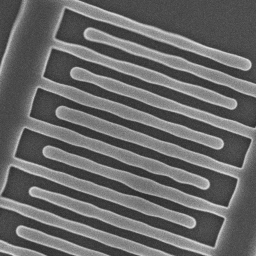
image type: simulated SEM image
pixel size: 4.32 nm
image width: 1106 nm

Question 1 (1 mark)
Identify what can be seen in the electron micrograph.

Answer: groups of lines, slits or small figures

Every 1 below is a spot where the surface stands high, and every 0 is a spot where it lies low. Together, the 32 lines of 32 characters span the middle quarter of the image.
00000000001111111100000000111111
00111100000001111111110000000011
00111110000000001111111100000000
00111111111000000001111111000000
00000011111111000000001111111000
10000000011111111000000001111111
11110000000111111111000000001111
11111100000000111111110000000001
01111111100000000111111110000000
00011111111100000000111111110000
00000011111111100000001111111100
11100000001111111100000000111111
11111100000001111111100000000111
11111111000000011111111000000000
00111111111100000001111111000000
00000111111111000000001111111100
10000001111111111000000011111111
11110000001111111111000000011111
11111100000001111111110000000011
11111111100000001111111110000000
00001111111100000000111111111000
00000001111111100000000111111110
11000000001111111100000001111111
11111000000001111111000000000111
11111111000000011111111100000001
00111111110000000011111111000000
00000011111110000000011111111000
10000000011111111000000011111111
11100000000111111111000000011111
11111100000000111111111000000111
01111111100000001111111111000000
00011111111100000011111111110000